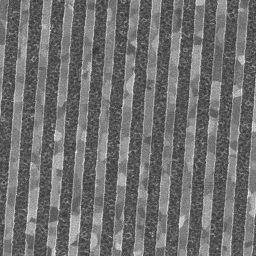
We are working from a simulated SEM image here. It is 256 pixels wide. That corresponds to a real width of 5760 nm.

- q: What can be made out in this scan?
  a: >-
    parallel lines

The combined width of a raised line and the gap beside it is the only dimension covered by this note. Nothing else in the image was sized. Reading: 490 nm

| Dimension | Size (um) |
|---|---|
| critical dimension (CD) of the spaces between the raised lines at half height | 0.294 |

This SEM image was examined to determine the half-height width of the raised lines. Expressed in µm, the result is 0.194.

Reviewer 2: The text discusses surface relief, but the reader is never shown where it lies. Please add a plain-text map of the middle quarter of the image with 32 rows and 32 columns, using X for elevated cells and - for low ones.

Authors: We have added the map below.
X----XX---XX---XXX---XX---XX----
X----XX---XX---XXX---XX---XX----
X----XX---XX---XXX---XX---XXX---
X---XXX---XX---XXX---XX---XX----
X---XX----XX---XX----XX---XX----
X---XX----XX---XX----XX---XX----
X---XX----XX---XX---XXX---XX----
X---XX----X----XX---XXX---XX----
X---XX----X----XX---XX----XX---X
X---XX---XX----XX---XX----XX---X
----XX---XX----XX---XX----XX---X
----XX---XX----XX---XX----XX---X
----XX---XX----XX---XX----XX---X
----XX---XX----XX---XX----XX---X
----XX---XX---XXX---XX---XX----X
----XX---XX---XXX---XX---XX----X
---XXX---XX---XX----XX---XX----X
---XXX---XX---XX----XX---XX----X
---XX----XX---XX----XX---XX---XX
---XX----XX---XX----XX---XX---XX
---XX----XX---XX----XX---XX---XX
---XX---XXX---XX---XXX---XX---XX
---XX---XX----XX---XXX---XX---XX
---XX---XXX---XX---XX----XX---XX
---XX---XX--X-XX---XX----XX---XX
---XX---XX----XX---XX----XX---XX
---XX---XX----XX---XX----XX---XX
---XX---XX----XX---XX---XXX---XX
---XX---XX----X----XX---XX----XX
--XX----XX---XX----XX---XXX---XX
--XX----XX---XX----XX---XX----XX
--XX----XX---XX----XX---XX--X-XX